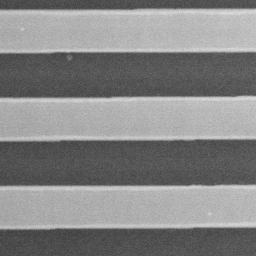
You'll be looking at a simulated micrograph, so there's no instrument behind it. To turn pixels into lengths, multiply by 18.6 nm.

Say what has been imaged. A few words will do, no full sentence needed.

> lines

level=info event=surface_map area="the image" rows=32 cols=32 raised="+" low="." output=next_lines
................................
++++++++++++++++++++++++++++++++
++++++++++++++++++++++++++++++++
++++++++++++++++++++++++++++++++
++++++++++++++++++++++++++++++++
++++++++++++++++++++++++++++++++
................................
................................
................................
................................
................................
................................
++++++++++++++++++++++++++++++++
++++++++++++++++++++++++++++++++
++++++++++++++++++++++++++++++++
++++++++++++++++++++++++++++++++
++++++++++++++++++++++++++++++++
................................
................................
................................
................................
................................
................................
++++++++++++++++++++++++++++++++
++++++++++++++++++++++++++++++++
++++++++++++++++++++++++++++++++
++++++++++++++++++++++++++++++++
++++++++++++++++++++++++++++++++
+...............................
................................
................................
................................